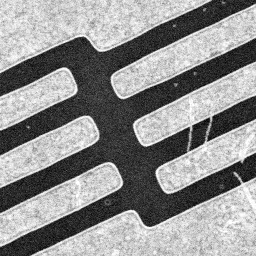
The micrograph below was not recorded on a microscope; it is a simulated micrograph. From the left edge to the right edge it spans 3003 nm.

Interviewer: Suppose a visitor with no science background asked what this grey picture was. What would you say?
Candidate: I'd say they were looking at groups of lines, slits or small figures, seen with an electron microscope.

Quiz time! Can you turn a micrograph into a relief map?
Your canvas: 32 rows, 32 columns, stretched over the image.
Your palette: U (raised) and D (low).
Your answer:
UUUUUUUUUUUUUUUUUUUUUUUUUDDDDDDD
UUUUUUUUUUUUUUUUUUUUUUUDDDDDDDUU
UUUUUUUUUUUUUUUUUUUUUDDDDDDDUUUU
UUUUUUUUUUUUUUUUUUUDDDDDDDUUUUUU
UUUUUUUUUUUUUUUUUDDDDDDDUUUUUUUU
UUUUUUUDDDDDUUUDDDDDDDUUUUUUUUDD
UUUUUDDDDDDDDDDDDDDUUUUUUUUUDDDD
UUUDDDDDDDDDDDDDDUUUUUUUUUDDDDDD
UDDDDDDDDDDDDDDDUUUUUUUUDDDDDDUU
DDDDDDUUUDDDDDUUUUUUUUDDDDDDUUUU
DDDDUUUUUDDDDDUUUUUUDDDDDDUUUUUU
DDUUUUUUUDDDDDDUUDDDDDDDUUUUUUUU
UUUUUUUUDDDDDDDDDDDDDDUUUUUUUUDD
UUUUUUDDDDDDDDDDDDDDUUUUUUUUDDDD
UUUUDDDDDDDDDDDDDDUUUUUUUUUDDDDD
UUDDDDDDDUUUDDDDDUUUUUUUDDDDDDDU
DDDDDDUUUUUUDDDDDUUUUUDDDDDDDUUU
DDDDUUUUUUUUDDDDDUUUDDDDDDDUUUUU
DDUUUUUUUUDDDDDDDDDDDDDDDUUUUUUU
UUUUUUUUDDDDDDDDDDDDDDDUUUUUUUUD
UUUUUUDDDDDDDUDDDDDDDUUUUUUUUDDD
UUUUDDDDDDDUUUUDDDDDUUUUUUUDDDDD
UUDDDDDDDUUUUUUDDDDDUUUUUDDDDDDU
DDDDDDDUUUUUUUUDDDDDUUUDDDDDDDUU
DDDDDUUUUUUUUDDDDDDDDDDDDDDUUUUU
DDDUUUUUUUUDDDDDDDDDDDDDDUUUUUUU
DUUUUUUUUDDDDDDDUDDDDDDUUUUUUUUU
UUUUUUUDDDDDDUUUUUDDDUUUUUUUUUUU
UUUUUDDDDDDUUUUUUUUUUUUUUUUUUUUU
UUUDDDDDDUUUUUUUUUUUUUUUUUUUUUUU
UDDDDDDUUUUUUUUUUUUUUUUUUUUUUUUU
DDDDDUUUUUUUUUUUUUUUUUUUUUUUUUUU